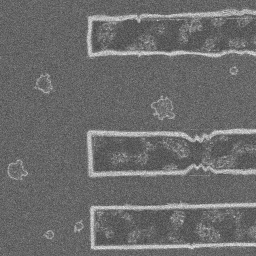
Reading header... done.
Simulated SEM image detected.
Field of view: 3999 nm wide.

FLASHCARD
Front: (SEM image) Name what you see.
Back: one or a few lines or trenches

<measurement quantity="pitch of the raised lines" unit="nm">1500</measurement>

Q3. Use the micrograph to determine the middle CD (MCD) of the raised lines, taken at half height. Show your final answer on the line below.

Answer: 619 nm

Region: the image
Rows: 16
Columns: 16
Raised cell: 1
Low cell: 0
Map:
0000000000000000
0000001111111111
0000001111111111
0000000000000000
0000000000000000
0000000000000000
0000000000000000
0000000000000000
0000001111110111
0000001111111111
0000001111110111
0000000000000000
0000000000000000
0000001111111111
0000001111111111
0000000000000000